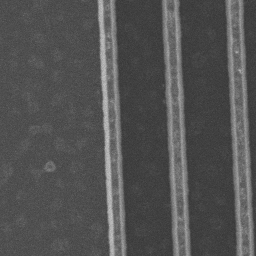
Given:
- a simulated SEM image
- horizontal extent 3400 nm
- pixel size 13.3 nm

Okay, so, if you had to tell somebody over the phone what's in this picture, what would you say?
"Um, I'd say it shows parallel lines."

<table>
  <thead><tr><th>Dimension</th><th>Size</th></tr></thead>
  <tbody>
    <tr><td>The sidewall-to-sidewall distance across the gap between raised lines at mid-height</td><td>0.67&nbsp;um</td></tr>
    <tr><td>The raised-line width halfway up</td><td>0.179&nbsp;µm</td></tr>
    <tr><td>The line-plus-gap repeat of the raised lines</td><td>848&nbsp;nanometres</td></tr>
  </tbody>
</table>